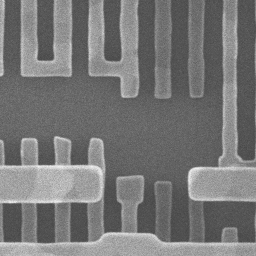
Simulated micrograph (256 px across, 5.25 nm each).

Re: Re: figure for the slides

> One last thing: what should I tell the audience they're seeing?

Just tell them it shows wiring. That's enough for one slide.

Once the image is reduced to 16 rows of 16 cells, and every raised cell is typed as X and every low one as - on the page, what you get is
----------------
----------------
----------------
----------------
----------------
----------------
----------------
----------------
----------------
----------------
XXXXXX------XXXX
XXXXXX------XXXX
XXXXXX------XXXX
----------------
----------------
XXXXXXXXXXXXXXXX